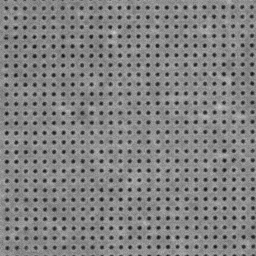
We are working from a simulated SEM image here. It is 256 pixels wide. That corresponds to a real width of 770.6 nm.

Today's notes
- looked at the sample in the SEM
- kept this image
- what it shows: a regular array of holes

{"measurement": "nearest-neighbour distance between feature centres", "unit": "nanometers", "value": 28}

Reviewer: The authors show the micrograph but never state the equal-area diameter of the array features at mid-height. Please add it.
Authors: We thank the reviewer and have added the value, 4.65 px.